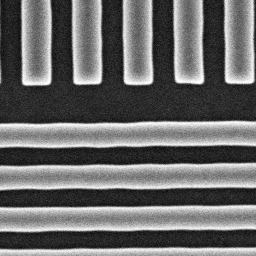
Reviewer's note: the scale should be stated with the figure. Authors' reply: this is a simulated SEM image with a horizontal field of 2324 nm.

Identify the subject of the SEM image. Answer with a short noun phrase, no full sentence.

groups of lines, slits or small figures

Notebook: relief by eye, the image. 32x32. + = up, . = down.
...+++...++++..++++...+++...++++
...+++...++++..++++...+++...++++
...+++...++++..++++...+++...++++
...+++...++++..++++...+++...++++
...+++...++++..++++...+++...++++
...+++...++++..++++...+++...++++
...+++...++++...+++...+++...++++
...+++...++++...+++...+++...++++
...+++...++++...+++...+++...++++
...+++...++++...+++...+++...++++
...+++..........................
................................
................................
................................
................................
.................+++++++++++++++
++++++++++++++++++++++++++++++++
++++++++++++++++++++++++++++++++
................................
................................
...............................+
++++++++++++++++++++++++++++++++
++++++++++++++++++++++++++++++++
++...++.........................
................................
................................
++++++++++++++++++++++++++++++++
++++++++++++++++++++++++++++++++
++++++++++++++++++++++++++++++++
................................
................................
++++++++++++++++++++++++++++++++